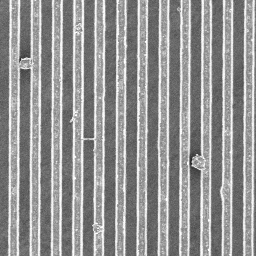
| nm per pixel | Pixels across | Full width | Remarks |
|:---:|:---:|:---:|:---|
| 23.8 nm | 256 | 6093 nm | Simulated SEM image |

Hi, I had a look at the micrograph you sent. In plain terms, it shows parallel lines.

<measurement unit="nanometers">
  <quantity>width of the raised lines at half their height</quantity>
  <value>211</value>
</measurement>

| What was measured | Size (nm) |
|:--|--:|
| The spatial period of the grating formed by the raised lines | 508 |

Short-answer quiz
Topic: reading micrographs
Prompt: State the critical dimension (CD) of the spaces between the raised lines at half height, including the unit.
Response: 295 nanometers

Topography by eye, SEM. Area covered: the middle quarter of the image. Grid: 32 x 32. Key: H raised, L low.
LLHHHLLLHHLLLHHLLLLHHLLLHHLLLHHL
LLHHHLLLHHLLLHHLLLLHHLLLHHLLLHHL
LLHHHLLLHHLLLHHLLLLHHLLLHHLLLHHL
LLHHHLLLHHLLLHHLLLLHHLLLHHLLLHHL
LLLHHLLLHHLLLHHLLLLHHLLLHHLLLHHL
LLLHHLLLHHLLLHHLLLLHHLLLHHLLLHHL
LLLHHLLLHHLLLHHLLLLHHLLLHHLLLHHL
LLLHHLLLHHLLLHHLLLLHHLLLHHLLLHHL
LLLHHLLLHHLLLHHLLLLHHLLLHHLLLHHL
LLLHHLLLHHLLLHHLLLLHHLLLHHLLLHHL
LLHHHLLLHHLLLHHLLLLHHLLLHHLLLHHL
LLLHHLLLHHLLLHHLLLLHHLLLHHLLLHHL
LLHHHLLLHHLLLHHLLLLHHLLLHHLLLHHL
LLHHHLLLHHLLLHHLLLLHHLLLHHLLLHHL
LLHHHLLLHHLLLHHLLLLHHLLLHHLLLHHL
LLHHHLLLHHLLLHHLLLLHHLLLHHLLLHHL
LLLHHLLLHHLLLHHLLLLHHLLLHHLLLHHL
LLLHHLLLHHLLLHHLLLLHHLLLHHLLLHHL
LLLHHLLHHHLLLHHLLLLHHLLLHHLLLHHL
LLLHHLLLHHLLLHHLLLLHHLLLHHLLLHHL
LLLHHLLLHHLLLHHLLLLHHLLLHHLLLHHL
LLLHHLLHHHLLLHHLLLLHLLLLHHLLLHHL
LLLHHLLLHHLLLHHLLLLHLLLLHHLLLHHL
LLLHHLLLHHLLLHHLLLLHLLLLHHLLLHHL
LLLHHLLLHHLLLHHLLLLHLLLLHHLLLHHL
LLLHHLLLHHLLLHHLLLLHLLLLHHLLLHHL
LLLHHLLLHHLLLHHLLLLHLLLLHHLLLHHL
LLLHHLLLHHLLLHHLLLHHLLLLHHLLLHHL
LLLHHLLLHHLLLHHLLLHHLLLLHHLLLHHL
LLLHHLLLHHLLLHHLLLHHLLLLHHLLLHHL
LLLHHLLLHHLLLHHLLLHHLLLLHHLLLHHL
LLLHHLLLHHLLLHHLLLHHLLLLHHLLLHHL